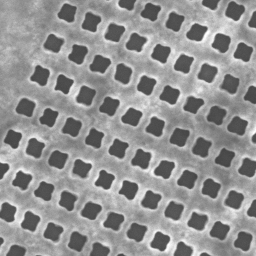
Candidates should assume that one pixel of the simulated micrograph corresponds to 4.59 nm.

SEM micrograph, a regular array of holes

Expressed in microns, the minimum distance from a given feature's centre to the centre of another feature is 0.115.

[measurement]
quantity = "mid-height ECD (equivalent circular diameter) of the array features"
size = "83.3 nanometres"